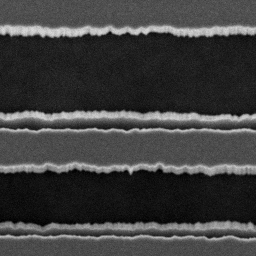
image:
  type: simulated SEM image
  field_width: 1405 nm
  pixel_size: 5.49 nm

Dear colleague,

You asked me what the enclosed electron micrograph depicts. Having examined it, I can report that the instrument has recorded lines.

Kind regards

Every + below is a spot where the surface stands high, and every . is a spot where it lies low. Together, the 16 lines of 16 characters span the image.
++++++++++++++++
++++++++++++++++
................
................
................
................
................
++++++++++++++++
++++++++++++++++
++++++++++++++++
+.....+....+++.+
................
................
................
++++++++++++++++
++++++++++++++++